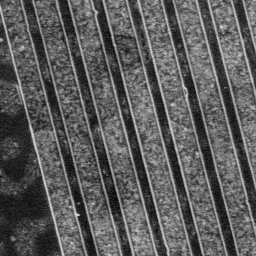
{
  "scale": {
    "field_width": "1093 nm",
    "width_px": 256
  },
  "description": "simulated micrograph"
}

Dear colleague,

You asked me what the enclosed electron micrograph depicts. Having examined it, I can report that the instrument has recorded parallel lines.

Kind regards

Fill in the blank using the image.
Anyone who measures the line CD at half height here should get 98.7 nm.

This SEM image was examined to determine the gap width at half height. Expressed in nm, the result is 45.4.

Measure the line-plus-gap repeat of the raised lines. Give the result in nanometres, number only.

145